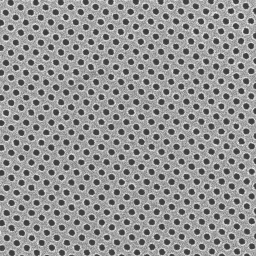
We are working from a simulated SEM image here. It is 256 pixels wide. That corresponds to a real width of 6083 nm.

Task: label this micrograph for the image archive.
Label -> a regular array of holes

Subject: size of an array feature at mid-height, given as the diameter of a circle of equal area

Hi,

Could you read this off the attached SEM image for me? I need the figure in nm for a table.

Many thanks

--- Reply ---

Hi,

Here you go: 152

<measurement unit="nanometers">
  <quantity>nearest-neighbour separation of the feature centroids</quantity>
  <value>260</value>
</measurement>